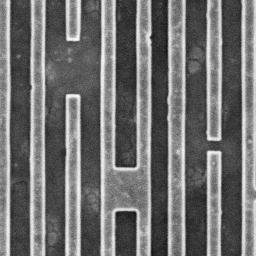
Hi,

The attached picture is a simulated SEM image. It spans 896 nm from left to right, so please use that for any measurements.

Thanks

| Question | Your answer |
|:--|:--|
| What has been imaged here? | parallel lines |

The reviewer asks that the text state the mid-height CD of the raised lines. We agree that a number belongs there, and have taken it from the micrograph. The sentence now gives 45 nm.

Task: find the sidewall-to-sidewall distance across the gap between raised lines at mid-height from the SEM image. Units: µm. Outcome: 0.0808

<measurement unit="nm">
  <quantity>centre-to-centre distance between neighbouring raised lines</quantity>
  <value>123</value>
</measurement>